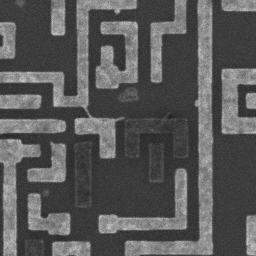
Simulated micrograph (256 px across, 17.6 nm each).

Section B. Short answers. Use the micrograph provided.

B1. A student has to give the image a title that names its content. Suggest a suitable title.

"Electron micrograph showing wiring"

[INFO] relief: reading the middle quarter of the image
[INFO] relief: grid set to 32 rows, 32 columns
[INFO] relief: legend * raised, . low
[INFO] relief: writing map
....**...****...**....**........
....**..******.***....**........
....**..**********....**........
....**..**********....**........
....**..**********....**........
....**..*****...................
....**..........................
....**...........*..............
******..........................
******..........................
******..........................
................................
................................
......**.................*......
...**********...***************.
...*********....***************.
...**********..****************.
.........****..****........****.
.........****..***..........***.
.........****..***..........***.
...****..****...**....***...***.
...****..****...**....***...***.
...****..****...**....***...***.
...***................***.......
...***................***.......
...****...............***.......
...****...............***...**..
...****...............***...***.
...****...............***...***.
...****.....................***.
...***......................***.
...***......................***.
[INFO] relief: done